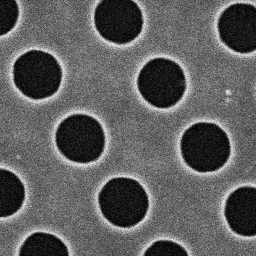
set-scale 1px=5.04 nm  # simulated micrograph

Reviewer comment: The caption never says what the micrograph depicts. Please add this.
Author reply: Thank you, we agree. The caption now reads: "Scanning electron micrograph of holes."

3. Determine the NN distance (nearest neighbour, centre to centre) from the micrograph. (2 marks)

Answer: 390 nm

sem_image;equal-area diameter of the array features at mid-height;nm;252